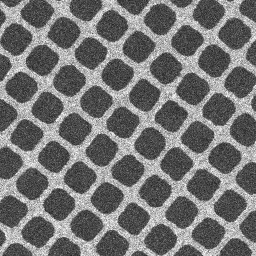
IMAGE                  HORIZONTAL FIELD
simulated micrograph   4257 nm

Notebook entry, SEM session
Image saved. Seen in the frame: a regular array of holes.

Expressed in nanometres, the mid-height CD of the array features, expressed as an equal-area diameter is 518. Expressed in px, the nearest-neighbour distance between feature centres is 33.8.